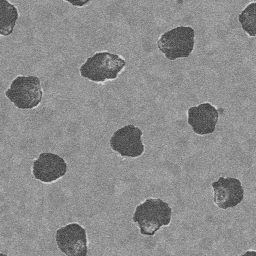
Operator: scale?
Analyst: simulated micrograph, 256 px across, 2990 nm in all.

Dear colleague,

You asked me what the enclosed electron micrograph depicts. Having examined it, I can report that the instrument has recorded a regular array of holes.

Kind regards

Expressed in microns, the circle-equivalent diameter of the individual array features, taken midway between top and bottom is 0.392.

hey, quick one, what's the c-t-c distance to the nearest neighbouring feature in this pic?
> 916 nanometers